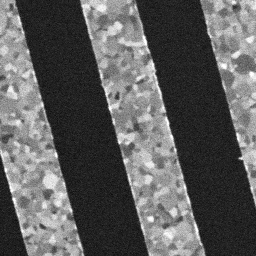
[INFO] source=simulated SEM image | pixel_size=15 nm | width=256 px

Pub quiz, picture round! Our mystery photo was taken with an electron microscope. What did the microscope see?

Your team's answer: one or a few lines or trenches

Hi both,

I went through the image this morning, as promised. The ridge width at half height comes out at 795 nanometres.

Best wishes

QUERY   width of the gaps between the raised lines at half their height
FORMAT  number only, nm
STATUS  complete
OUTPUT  951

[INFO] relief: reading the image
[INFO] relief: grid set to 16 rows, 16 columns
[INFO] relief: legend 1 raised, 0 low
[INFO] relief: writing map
1000011110000111
1000011110000111
1100001110000111
1100001110000111
1100001111000011
1100001111000011
1110000111000011
1110000111000001
1110000111100001
1110000011100001
1111000011100001
0111000011110000
0111000011110000
0111100001110000
0111100001110000
0011100001111000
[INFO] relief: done